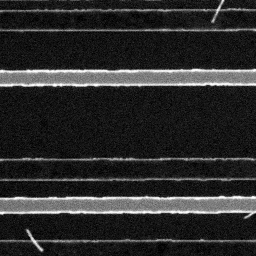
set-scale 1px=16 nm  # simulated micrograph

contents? lines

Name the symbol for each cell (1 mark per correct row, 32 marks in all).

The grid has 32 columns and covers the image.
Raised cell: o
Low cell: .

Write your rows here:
................................
oooooooooooooooooooooooooooooooo
oooooooooooooooooooooooooooooooo
oooooooooooooooooooooooooooooooo
................................
................................
................................
................................
................................
oooooooooooooooooooooooooooooooo
oooooooooooooooooooooooooooooooo
................................
................................
................................
................................
................................
................................
................................
................................
................................
oooooooooooooooooooooooooooooooo
oooooooooooooooooooooooooooooooo
oooooooooooo....oo..............
................................
................................
oooooooooooooooooooooooooooooooo
oooooooooooooooooooooooooooooooo
................................
................................
................................
oooooooooooooooooooooooooooooooo
oooooooooooooooooooooooooooooooo